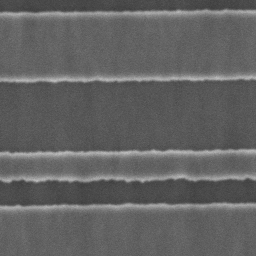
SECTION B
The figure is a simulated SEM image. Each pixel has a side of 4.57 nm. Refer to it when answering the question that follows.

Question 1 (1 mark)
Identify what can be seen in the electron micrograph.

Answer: lines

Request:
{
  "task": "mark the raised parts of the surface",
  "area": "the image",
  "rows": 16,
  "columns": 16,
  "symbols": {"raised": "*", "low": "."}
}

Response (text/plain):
................
****************
****************
****************
****************
................
................
................
................
....************
****************
................
................
****************
****************
****************